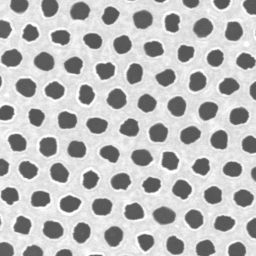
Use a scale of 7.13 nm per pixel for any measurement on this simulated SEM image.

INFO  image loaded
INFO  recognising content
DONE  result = a regular array of holes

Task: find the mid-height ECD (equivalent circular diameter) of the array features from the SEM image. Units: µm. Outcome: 0.133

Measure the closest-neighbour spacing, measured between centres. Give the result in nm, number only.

214